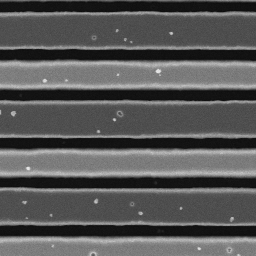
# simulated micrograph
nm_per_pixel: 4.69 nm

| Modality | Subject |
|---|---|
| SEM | lines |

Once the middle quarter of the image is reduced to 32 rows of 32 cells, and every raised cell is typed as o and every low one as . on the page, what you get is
oooooooooooooooooooooooooooooooo
oooooooooooooooooooooooooooooooo
oooooooooooooooooooooooooooooooo
oooooooooooooooooooooooooooooooo
oooooooooooooooooooooooooooooooo
oooooooooooooooooooooooooooooooo
................................
................................
................................
oooooooooooooooooooooooooooooooo
oooooooooooooooooooooooooooooooo
oooooooooooooooooooooooooooooooo
oooooooooooooooooooooooooooooooo
oooooooooooooooooooooooooooooooo
oooooooooooooooooooooooooooooooo
oooooooooooooooooooooooooooooooo
oooooooooooooooooooooooooooooooo
oooooooooooooooooooooooooooooooo
o................ooooo..........
................................
................................
oooooooooooooooooooooooooooooooo
oooooooooooooooooooooooooooooooo
oooooooooooooooooooooooooooooooo
oooooooooooooooooooooooooooooooo
oooooooooooooooooooooooooooooooo
oooooooooooooooooooooooooooooooo
oooooooooooooooooooooooooooooooo
................................
................................
................................
oooooooooooooooooooooooooooooooo